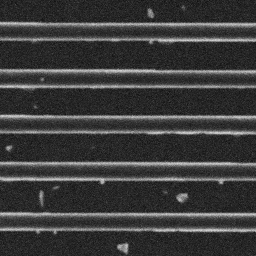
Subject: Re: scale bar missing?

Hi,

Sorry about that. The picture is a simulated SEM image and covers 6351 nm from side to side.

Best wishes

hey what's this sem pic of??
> lines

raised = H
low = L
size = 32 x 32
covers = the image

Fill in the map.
LLLLLLLLLLLLLLLLLLLLLLLLLLLLLLLL
LLLLLLLLLLLLLLLLLLLLLLLLLLLLLLLL
LLLLLLLLLLLLLLLLLLLLLLLLLLLLLLLL
HHHHHHHHHHHHHHHHHHHHHHHHHHHHHHHH
HHHHHHHHHHHHHHHHHHHHHHHHHHHHHHHH
LLLLLLLLLLLLLLLLLLLLLLLLLLLLLLLL
LLLLLLLLLLLLLLLLLLLLLLLLLLLLLLLL
LLLLLLLLLLLLLLLLLLLLLLLLLLLLLLLL
LLLLLLLLLLLLLLLLLLLLLLLLLLLLLLLL
HHHHHHHHHHHHHHHHHHHHHHHHHHHHHHHH
HHHHHHHHHHHHHHHHHHHHHHHHHHHHHHHH
LLLLLLLLLLLLLLLLLLLLLLLLLLLLLLLL
LLLLLLLLLLLLLLLLLLLLLLLLLLLLLLLL
LLLLLLLLLLLLLLLLLLLLLLLLLLLLLLLL
LLLLLLLLLLLLLLLLLLLLLLLLLLLLLLLL
HHHHHHHHHHHHHHHHHHHHHHHHHHHHHHHH
HHHHHHHHHHHHHHHHHHHHHHHHHHHHHHHH
LLLLLLLLLLLLLLLLLLLLLLLLLLLLLLLL
LLLLLLLLLLLLLLLLLLLLLLLLLLLLLLLL
LLLLLLLLLLLLLLLLLLLLLLLLLLLLLLLL
HHHHHHHHHHHHHHHHHHHHHHHHHHHHHHHH
HHHHHHHHHHHHHHHHHHHHHHHHHHHHHHHH
LLLLLLLLLLLLLLLLLLLLLLLLLLLLLLLL
LLLLLLLLLLLLLLLLLLLLLLLLLLLLLLLL
LLLLLLLLLLLLLLLLLLLLLLLLLLLLLLLL
LLLLLLLLLLLLLLLLLLLLLLLLLLLLLLLL
LLLLLLLLLLLLLLLLLLLLLLLLLLLLLLLL
HHHHHHHHHHHHHHHHHHHHHHHHHHHHHHHH
HHHHHHHHHHHHHHHHHHHHHHHHHHHHHHHH
LLLLLLLLLLLLLLLLLLLLLLLLLLLLLLLL
LLLLLLLLLLLLLLLLLLLLLLLLLLLLLLLL
LLLLLLLLLLLLLLLLLLLLLLLLLLLLLLLL